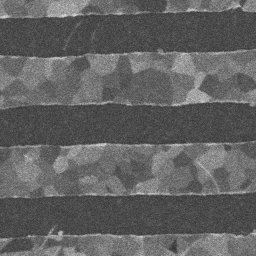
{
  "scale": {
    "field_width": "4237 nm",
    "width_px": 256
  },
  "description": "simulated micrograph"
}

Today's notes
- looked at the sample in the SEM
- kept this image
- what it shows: one or a few lines or trenches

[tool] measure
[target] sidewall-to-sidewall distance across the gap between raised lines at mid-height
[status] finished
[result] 666 nm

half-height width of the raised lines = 832 nm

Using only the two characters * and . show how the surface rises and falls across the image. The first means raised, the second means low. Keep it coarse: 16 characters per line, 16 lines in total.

****************
................
................
.....***********
****************
****************
******..****....
................
................
****************
****************
****************
................
................
................
****************